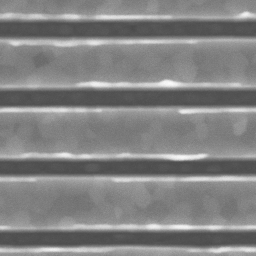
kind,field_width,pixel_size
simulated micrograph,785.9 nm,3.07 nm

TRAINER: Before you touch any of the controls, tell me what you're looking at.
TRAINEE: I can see one or a few lines or trenches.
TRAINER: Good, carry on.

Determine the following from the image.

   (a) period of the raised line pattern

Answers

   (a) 214 nanometres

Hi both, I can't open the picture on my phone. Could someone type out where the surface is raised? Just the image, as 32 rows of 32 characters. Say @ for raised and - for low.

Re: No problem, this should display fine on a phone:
@@@@@@@@@@@@@@@@@@@@@@@@@@@@@@@@
@@@@@@@@@@@@@@@@@@@@@@@@@@@@@@@@
---@@--@@-@@@@@-@--@@-----------
--------------------------------
--------------------------------
@@@@@@@@@@@@@@@@@@@@@@@@@@@@@@@@
@@@@@@@@@@@@@@@@@@@@@@@@@@@@@@@@
@@@@@@@@@@@@@@@@@@@@@@@@@@@@@@@@
@@@@@@@@@@@@@@@@@@@@@@@@@@@@@@@@
@@@@@@@@@@@@@@@@@@@@@@@@@@@@@@@@
@@@@@@@@@@@@@@@@@@@@@@@@@@@@@@@@
--------------------------------
--------------------------------
---------------------------@@@@@
@@@@@@@@@@@@@@@@@@@@@@@@@@@@@@@@
@@@@@@@@@@@@@@@@@@@@@@@@@@@@@@@@
@@@@@@@@@@@@@@@@@@@@@@@@@@@@@@@@
@@@@@@@@@@@@@@@@@@@@@@@@@@@@@@@@
@@@@@@@@@@@@@@@@@@@@@@@@@@@@@@@@
@@@@@@@@@@@@@@@@@@@@@@@@@@@@@@@@
--------------------------------
--------------------------------
@@@@@@@@@@@@@@@@@@@@@@@@@@@@@@@@
@@@@@@@@@@@@@@@@@@@@@@@@@@@@@@@@
@@@@@@@@@@@@@@@@@@@@@@@@@@@@@@@@
@@@@@@@@@@@@@@@@@@@@@@@@@@@@@@@@
@@@@@@@@@@@@@@@@@@@@@@@@@@@@@@@@
@@@@@@@@@@@@@@@@@@@@@@@@@@@@@@@@
@@@@@@@@@@@@@@@@@@@@@@@@@@@@@@@@
--------------------------------
--------------------------------
@@@@@@@@@@@@@@@@@@@@@@@@@@@@@@@@